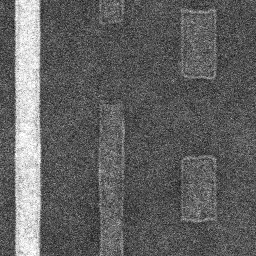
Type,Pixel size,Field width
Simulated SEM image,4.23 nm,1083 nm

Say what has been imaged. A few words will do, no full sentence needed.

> one or a few lines or trenches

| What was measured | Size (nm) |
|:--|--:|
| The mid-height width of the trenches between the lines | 255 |